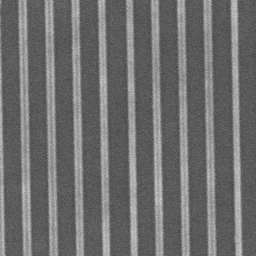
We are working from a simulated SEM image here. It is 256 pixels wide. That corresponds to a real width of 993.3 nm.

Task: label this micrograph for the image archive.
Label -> parallel lines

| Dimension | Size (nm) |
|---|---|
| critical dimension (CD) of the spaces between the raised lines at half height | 77.1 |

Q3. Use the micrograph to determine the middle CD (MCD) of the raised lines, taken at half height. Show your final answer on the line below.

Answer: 24.2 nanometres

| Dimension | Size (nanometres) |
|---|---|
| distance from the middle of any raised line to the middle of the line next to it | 102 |